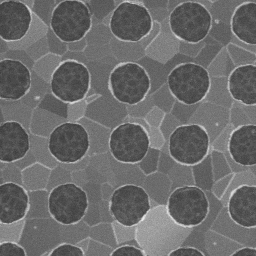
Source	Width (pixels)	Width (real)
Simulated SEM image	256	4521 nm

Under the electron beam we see a regular array of holes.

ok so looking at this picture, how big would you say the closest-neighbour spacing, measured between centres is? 1050 nm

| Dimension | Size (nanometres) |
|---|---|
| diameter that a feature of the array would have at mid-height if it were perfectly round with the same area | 705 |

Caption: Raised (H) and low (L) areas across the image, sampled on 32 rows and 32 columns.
LLLHHHHLLLHHHHHLLHHHHHHLLHHHHHLL
LLLLHHHLLLLHHHLLLLHHHHLLLLHHHLLL
LLLLHHLLLLLHHHLLLLLHHLLLLLHHHLLL
LLLLHHHLLLLHHHLLLLLHHLLLLLHHHLLL
LLLHHHHLLLHHHHLLLLHHHHLLLLHHHHLL
HHHHHHHHHHHHHHHHHHHHHHHHHHHHHHHL
HHHHHHHHHHHHHHHHHHHHHHHHHHHHHHHH
HHHHHHHHHHHHHHHHHHHHHHHHHHHHHHHH
LLLHHHHLLLLHHHHLLLHHHHLLLHHHHHLL
LLLLHHHLLLLHHHLLLLHHHLLLLLHHHLLL
LLLLHHLLLLLHHHLLLLLHHLLLLLHHHLLL
LLLHHHHLLLLHHHLLLLHHHLLLLLHHHLLL
HHHHHHHHLLHHHHHLLLHHHHLLLHHHHHLL
HHHHHHHHHHHHHHHHHHHHHHHHHHHHHHHH
HHHHHHHHHHHHHHHHHHHHHHHHHHHHHHHH
HLHHHHHHLHHHHHHHLHHHHHHHHHHHHHHH
LLLHHHHLLLLHHHLLLLHHHHLLLLHHHLLL
LLLLHHLLLLLHHHLLLLLHHLLLLLHHHLLL
LLLLHHLLLLLHHHLLLLLHHLLLLLHHHLLL
LLLHHHHLLLHHHHLLLLHHHLLLLLHHHLLL
HHHHHHHHHHHHHHHHHHHHHHHLHHHHHHLL
HHHHHHHHHHHHHHHHHHHHHHHHHHHHHHHH
HHHHHHHHHHHHHHHHHHHHHHHHHHHHHHHH
LLLHHHHLLLHHHHHLLLHHHHHLLHHHHHLL
LLLHHHLLLLLHHHLLLLLHHLLLLLHHHLLL
LLLLHHLLLLLHHHLLLLLHHLLLLLHHHLLL
LLLHHHLLLLLHHHLLLLHHHLLLLLHHHLLL
LLHHHHHLLLHHHHHLLLHHHHLLLHHHHLLL
HHHHHHHHHHHHHHHHHHHHHHHHHHHHHHHH
HHHHHHHHHHHHHHHHHHHHHHHHHHHHHHHH
LLHHHHHHHHHHHHHHHHHHHHHHHHHHHHHH
LLLHHHHLLLHHHHLLLLHHHHLLLHHHHHLL